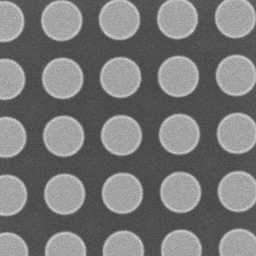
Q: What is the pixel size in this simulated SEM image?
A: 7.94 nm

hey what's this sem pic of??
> an array of small figures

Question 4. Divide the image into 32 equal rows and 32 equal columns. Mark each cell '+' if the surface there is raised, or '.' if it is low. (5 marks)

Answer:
++....+++....+++.....+++....+++.
+++..+++++...++++...+++++..+++++
+++..+++++..+++++...+++++..+++++
+++..+++++...++++...++++...+++++
++....+++.....++.....++.....++..
................................
................................
+......++.....++.....+++....+++.
+++...++++...++++...+++++..+++++
+++..+++++...+++++..+++++..+++++
+++..+++++...++++...+++++..+++++
++....++++...++++....+++....+++.
................................
................................
......................+......++.
+++...++++...++++...+++++...++++
+++...++++...+++++..+++++..+++++
+++...++++...+++++..+++++..+++++
+++...++++...++++....+++....+++.
+...............................
................................
.............................+..
++....++++...++++....+++....++++
+++...++++...+++++..+++++..+++++
+++...++++...+++++..+++++..+++++
+++...++++...++++....++++...++++
++.....++.....++......+.........
................................
................................
++.....+++....+++....+++....++++
+++...++++...+++++..+++++..+++++
+++...+++++..+++++..+++++..+++++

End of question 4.